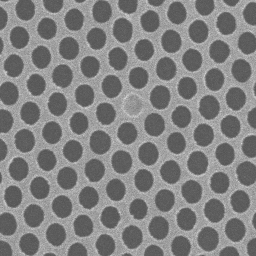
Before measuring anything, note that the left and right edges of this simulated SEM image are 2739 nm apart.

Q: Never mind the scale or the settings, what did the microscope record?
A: a regular array of holes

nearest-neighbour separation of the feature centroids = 0.299 µm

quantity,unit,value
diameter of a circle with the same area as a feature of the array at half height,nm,231